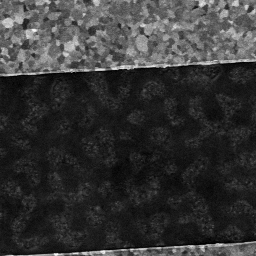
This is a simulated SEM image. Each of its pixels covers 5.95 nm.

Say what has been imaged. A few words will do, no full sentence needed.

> one or a few lines or trenches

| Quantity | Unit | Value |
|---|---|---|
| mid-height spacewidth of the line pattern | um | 1.08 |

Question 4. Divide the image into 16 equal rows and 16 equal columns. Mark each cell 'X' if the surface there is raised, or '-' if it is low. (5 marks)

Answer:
XXXXXXXXXXXXXXXX
XXXXXXXXXXXXXXXX
XXXXXXXXXXXXXXXX
XXXXXXXXXXXXXXXX
XXXXX-----------
----------------
----------------
----------------
----------------
----------------
----------------
----------------
----------------
----------------
----------------
----------XXXXXX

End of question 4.